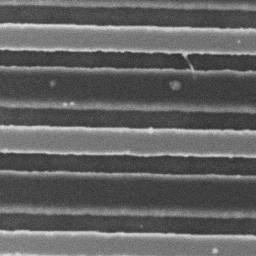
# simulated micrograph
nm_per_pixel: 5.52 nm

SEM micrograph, lines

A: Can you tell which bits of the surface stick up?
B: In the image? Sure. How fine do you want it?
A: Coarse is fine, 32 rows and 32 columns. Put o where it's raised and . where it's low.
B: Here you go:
..........oo.ooooooooooooooooooo
................................
................................
oooooooooooooooooooo............
oooooooooooooooooooooooooooooooo
oooooooooooooooooooooooooooooooo
..................o.oooooooooooo
................................
ooooooooo.......................
oooooooooooooooooooooooooooooooo
oooooooooooooooooooooooooooooooo
oooooooooooooooooooooooooooooooo
oooooooooooooooooooooooooooooooo
.......................ooooooooo
................................
................................
ooooooooooooooooooooooooooooo.o.
oooooooooooooooooooooooooooooooo
oooooooooooooooooooooooooooooooo
..................o....ooooooooo
................................
oooooo.oo.......................
oooooooooooooooooooooooooooooooo
oooooooooooooooooooooooooooooooo
oooooooooooooooooooooooooooooooo
oooooooooooooooooooooooooooooooo
......o..ooooooooooooooooooooooo
................................
................................
oooooooooooooooooooooooo........
oooooooooooooooooooooooooooooooo
oooooooooooooooooooooooooooooooo